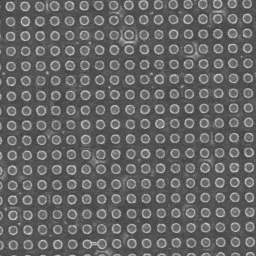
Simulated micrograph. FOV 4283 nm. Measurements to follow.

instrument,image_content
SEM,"a regular array of raised bodies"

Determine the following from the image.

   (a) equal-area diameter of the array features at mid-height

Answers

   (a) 146 nm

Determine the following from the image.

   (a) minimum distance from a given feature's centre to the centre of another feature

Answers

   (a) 244 nanometres